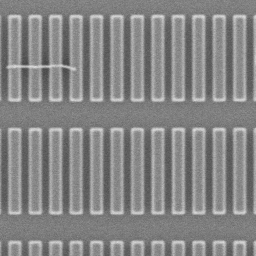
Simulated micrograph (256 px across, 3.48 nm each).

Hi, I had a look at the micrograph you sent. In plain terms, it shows groups of lines, slits or small figures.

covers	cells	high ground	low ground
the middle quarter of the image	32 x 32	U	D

DUUUDDDUUDDDUUDDDUUUDDUUUDDUUUDD
DDUUDDDUUDDDUUDDDUUUDDUUUDDUUUDD
DDUUDDDUUDDDUUDDDUUUDDUUUDDUUUDD
DDUUDDDUUDDDUUDDDUUUDDUUUDDUUUDD
DDUUDDDUUDDDUUDDDUUUDDUUUDDUUUDD
DDUUDDDUUDDDUUDDDUUUDDUUUDDUUUDD
DDUUDDDUUDDDUUDDDUUUDDUUUDDUUUDD
DDUUDDDUUDDDUUDDDUUUDDUUUDDUUUDD
DDUUDDDUUDDDUUDDDUUUDDUUUDDUUUDD
DDDDDDDDDDDDDDDDDDDDDDDDDDDDDDDD
DDDDDDDDDDDDDDDDDDDDDDDDDDDDDDDD
DDDDDDDDDDDDDDDDDDDDDDDDDDDDDDDD
DDDDDDDDDDDDDDDDDDDDDDDDDDDDDDDD
DDDDDDDDDDDDDDDDDDDDDDDDDDDDDDDD
DDDDDDDDDDDDDDDDDDDDDDDDDDDDDDDD
DDDDDDDDDDDDDDDDDDDDDDDDDDDDDDDD
DDUUDDDUUDDDUUDDDUUDDDUUDDDUUUDD
DDUUDDDUUDDDUUDDDUUUDDUUUDDUUUDD
DDUUDDDUUDDDUUDDDUUUDDUUUDDUUUDD
DDUUDDDUUDDDUUDDDUUUDDUUUDDUUUDD
DDUUDDDUUDDDUUDDDUUUDDUUUDDUUUDD
DDUUDDDUUDDDUUDDDUUUDDUUUDDUUUDD
DDUUDDDUUDDDUUDDDUUUDDUUUDDUUUDD
DDUUDDDUUDDDUUDDDUUUDDUUUDDUUUDD
DDUUDDDUUDDDUUDDDUUUDDUUUDDUUUDD
DDUUDDDUUDDDUUDDDUUUDDUUUDDUUUDD
DDUUDDDUUDDDUUDDDUUUDDUUUDDUUUDD
DDUUDDDUUDDDUUDDDUUUDDUUUDDUUUDD
DDUUDDDUUDDDUUDDDUUUDDUUUDDUUUDD
DDUUDDDUUDDDUUDDDUUUDDUUUDDUUUDD
DDUUDDDUUDDDUUDDDUUUDDUUUDDUUUDD
DDUUDDDUUDDDUUDDDUUUDDUUUDDUUUDD